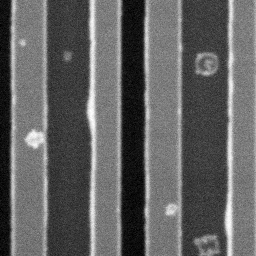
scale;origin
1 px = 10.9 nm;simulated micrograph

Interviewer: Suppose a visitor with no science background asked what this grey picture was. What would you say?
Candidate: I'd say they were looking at lines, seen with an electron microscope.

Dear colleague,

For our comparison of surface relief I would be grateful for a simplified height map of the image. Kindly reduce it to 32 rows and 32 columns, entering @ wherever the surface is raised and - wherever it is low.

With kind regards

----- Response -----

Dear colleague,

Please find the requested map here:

--@@@@------@@@---@@@@-------@@@
--@@@@------@@@---@@@@-------@@@
--@@@@------@@@---@@@@-------@@@
--@@@@------@@@---@@@@-------@@@
--@@@@------@@@---@@@@-------@@@
--@@@@------@@@---@@@@-------@@@
--@@@@------@@@---@@@@-------@@@
--@@@@------@@@---@@@@-------@@@
--@@@@------@@@---@@@@-------@@@
--@@@@------@@@---@@@@-------@@@
--@@@@------@@@---@@@@-------@@@
--@@@@------@@@---@@@@-------@@@
--@@@@------@@@---@@@@-------@@@
--@@@@------@@@---@@@@-------@@@
--@@@@-----@@@@---@@@@-------@@@
--@@@@------@@@---@@@@-------@@@
--@@@@------@@@---@@@@-------@@@
--@@@@------@@@---@@@@-------@@@
--@@@@------@@@---@@@@-------@@@
--@@@@------@@@---@@@@-------@@@
--@@@@------@@@---@@@@-------@@@
--@@@@------@@@---@@@@-------@@@
--@@@@------@@@---@@@@-------@@@
--@@@@------@@@---@@@@-------@@@
--@@@@------@@@---@@@@-------@@@
--@@@@------@@@---@@@@-------@@@
--@@@@------@@@---@@@@-------@@@
--@@@@------@@@---@@@@-------@@@
--@@@@------@@@---@@@@-------@@@
--@@@@------@@@---@@@@-------@@@
--@@@@------@@@---@@@@-------@@@
--@@@@------@@@---@@@@-------@@@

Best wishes